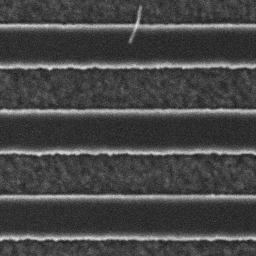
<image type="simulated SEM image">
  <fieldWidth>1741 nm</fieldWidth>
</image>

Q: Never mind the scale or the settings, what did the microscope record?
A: lines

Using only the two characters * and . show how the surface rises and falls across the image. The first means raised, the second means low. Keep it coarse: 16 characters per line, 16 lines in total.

................
................
****************
****************
................
................
................
****************
****************
****************
................
................
****************
****************
****************
................